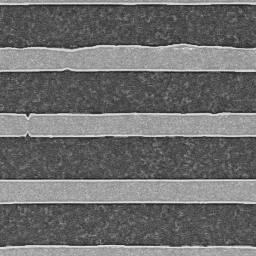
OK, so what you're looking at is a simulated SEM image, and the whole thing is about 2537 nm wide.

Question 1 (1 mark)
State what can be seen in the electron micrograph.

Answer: one or a few lines or trenches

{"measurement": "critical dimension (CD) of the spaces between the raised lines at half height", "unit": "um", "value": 0.438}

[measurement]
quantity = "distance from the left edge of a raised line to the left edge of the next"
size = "655 nm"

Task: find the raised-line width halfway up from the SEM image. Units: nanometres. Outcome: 219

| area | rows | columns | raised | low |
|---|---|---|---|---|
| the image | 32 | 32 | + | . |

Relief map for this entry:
................................
................................
................................
................................
................................
................................
++++++++++++++++++++++++++++++++
++++++++++++++++++++++++++++++++
++++++++++++++++++++++++++++++++
................................
................................
................................
................................
................................
+++.++++++++++++++++++++++++++++
++++++++++++++++++++++++++++++++
++++++++++++++++++++++++++++++++
................................
................................
................................
................................
................................
................................
++++++++++++++++++++++++++++++++
++++++++++++++++++++++++++++++++
................................
................................
................................
................................
................................
................................
++++++++++++++++++++++++++++++++